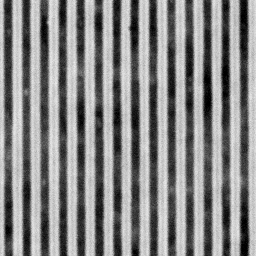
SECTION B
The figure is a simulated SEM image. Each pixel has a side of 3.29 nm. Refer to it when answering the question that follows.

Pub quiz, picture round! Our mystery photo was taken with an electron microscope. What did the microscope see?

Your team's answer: parallel lines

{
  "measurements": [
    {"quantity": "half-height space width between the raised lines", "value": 37.4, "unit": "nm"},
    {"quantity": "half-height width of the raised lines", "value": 24.7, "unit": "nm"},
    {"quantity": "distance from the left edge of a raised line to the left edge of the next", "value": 18.1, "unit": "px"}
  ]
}